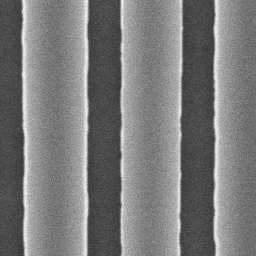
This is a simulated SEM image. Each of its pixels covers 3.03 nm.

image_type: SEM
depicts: lines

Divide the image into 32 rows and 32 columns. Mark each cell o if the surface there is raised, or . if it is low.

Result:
...oooooooo....oooooooo....ooooo
...oooooooo....oooooooo....ooooo
...oooooooo....oooooooo....ooooo
...oooooooo....oooooooo....ooooo
...oooooooo....oooooooo....ooooo
...oooooooo....oooooooo....ooooo
...oooooooo....oooooooo....ooooo
...oooooooo....oooooooo....ooooo
...oooooooo....oooooooo....ooooo
...oooooooo....oooooooo....ooooo
...oooooooo....oooooooo....ooooo
...oooooooo....oooooooo....ooooo
...oooooooo....oooooooo....ooooo
...oooooooo....oooooooo....ooooo
...oooooooo....oooooooo....ooooo
...oooooooo....ooooooo.....ooooo
...oooooooo....oooooooo....ooooo
...oooooooo....oooooooo....ooooo
...oooooooo....ooooooo.....ooooo
...oooooooo....ooooooo.....ooooo
...oooooooo....ooooooo.....ooooo
...oooooooo....oooooooo....ooooo
...oooooooo....oooooooo....ooooo
...oooooooo....ooooooo.....ooooo
...oooooooo....ooooooo.....ooooo
...oooooooo....ooooooo.....ooooo
...oooooooo....ooooooo.....ooooo
...oooooooo....ooooooo.....ooooo
...oooooooo....ooooooo.....ooooo
...oooooooo....ooooooo.....ooooo
...oooooooo....ooooooo.....ooooo
...oooooooo....ooooooo.....ooooo